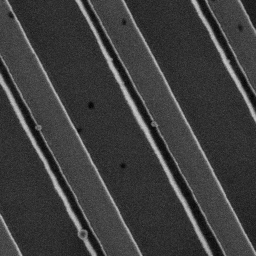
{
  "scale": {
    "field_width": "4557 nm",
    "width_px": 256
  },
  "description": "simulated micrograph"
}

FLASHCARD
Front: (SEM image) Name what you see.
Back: lines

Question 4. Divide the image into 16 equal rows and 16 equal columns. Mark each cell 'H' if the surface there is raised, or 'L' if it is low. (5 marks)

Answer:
HLLLLHHHLLLLHHHL
HLLLLLHHLLLLLHHH
HHLLLLHHHLLLLHHH
HHLLLLLHHHLLLLHH
HHHLLLLHHHLLLLLH
HHHLLLLLHHHLLLLH
LHHHLLLLHHHLLLLL
LHHHLLLLLHHHLLLL
LLHHHLLLLHHHLLLL
LLHHHLLLLLHHHLLL
LLLHHHLLLLHHHLLL
LLLLHHHLLLLHHHLL
LLLLHHHLLLLHHHLL
LLLLLHHHLLLLHHHL
HLLLLHHHLLLLHHHL
HLLLLLHHHLLLLHHH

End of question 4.